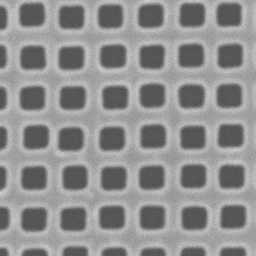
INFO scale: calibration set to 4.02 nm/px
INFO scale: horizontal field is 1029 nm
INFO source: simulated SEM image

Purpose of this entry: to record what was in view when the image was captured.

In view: a regular array of holes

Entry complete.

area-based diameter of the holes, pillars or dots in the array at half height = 112 nanometres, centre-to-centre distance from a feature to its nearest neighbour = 0.154 um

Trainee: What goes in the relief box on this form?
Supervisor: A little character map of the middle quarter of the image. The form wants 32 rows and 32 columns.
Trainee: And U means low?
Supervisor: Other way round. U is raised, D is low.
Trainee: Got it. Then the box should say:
DDDDDUUUUDDDDDDUUUUDDDDDDUUUUDDD
DDDUUUUUUUUUUUUUUUUUDDDUUUUUUUUU
UUUUUUUUUUUUUUUUUUUUUUUUUUUUUUUU
UUUUUUUUUUUUUUUUUUUUUUUUUUUUUUUU
UUUUUUUUUUUUUUUUUUUUUUUUUUUUUUUU
DDDDUUUUUUUDDDDUUUUDDDDDDUUUUDDD
DDDDDUUUUUDDDDDDUUUDDDDDDDUUDDDD
DDDDDDUUUDDDDDDDUUUDDDDDDDUUDDDD
DDDDDUUUUDDDDDDDUUUDDDDDDDUUDDDD
DDDDDUUUUUDDDDDDUUUDDDDDDUUUDDDD
DDDDDUUUUUDDDDDDUUUDDDDDDUUUUDDD
DDDDUUUUUUUDDUDUUUUUUUUUUUUUUUUU
UUUUUUUUUUUUUUUUUUUUUUUUUUUUUUUU
UUUUUUUUUUUUUUUUUUUUUUUUUUUUUUUU
UUUUUUUUUUUUUUUUUUUUUUUUUUUUUUUU
UUUUUUUUUUUDDDUUUUUUDDDDDUUUUUDD
DDDDDUUUUDDDDDDUUUUDDDDDDDUUUDDD
DDDDDUUUUDDDDDDUUUUDDDDDDDUUUDDD
DDDDDUUUUDDDDDDUUUUDDDDDDDUUUDDD
DDDDDUUUUDDDDDDUUUUDDDDDDDUUUDDD
DDDDDUUUUDDDDDDUUUUDDDDDDUUUUDDD
DDDDUUUUUDDDDDUUUUUUUUUUUUUUUUUU
UUUUUUUUUUUUUUUUUUUUUUUUUUUUUUUU
UUUUUUUUUUUUUUUUUUUUUUUUUUUUUUUU
UUUUUUUUUUUUUUUUUUUUUUUUUUUUUUUU
UDDDDUUUUUUUUDDUUUUUDDDDDUUUUUDD
DDDDDDUUUDDDDDDDUUUDDDDDDUUUUDDD
DDDDDDUUUDDDDDDDUUDDDDDDDUUUUDDD
DDDDDDUUUDDDDDDDUUDDDDDDDUUUUDDD
DDDDDDUUUDDDDDDDUUDDDDDDDUUUUDDD
DDDDDDUUUDDDDDDDUUUDDDDDDUUUUDDD
UDDDDUUUUUDDDDDUUUUUDDDDUUUUUUUU